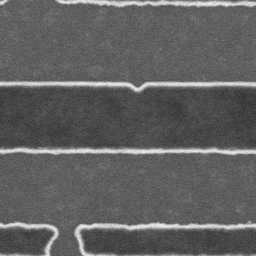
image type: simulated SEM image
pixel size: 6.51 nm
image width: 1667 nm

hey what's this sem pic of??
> one or a few lines or trenches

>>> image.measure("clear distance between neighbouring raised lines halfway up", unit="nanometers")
496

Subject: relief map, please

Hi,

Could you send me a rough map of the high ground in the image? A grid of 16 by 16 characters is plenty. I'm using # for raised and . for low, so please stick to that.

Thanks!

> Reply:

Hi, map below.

................
................
................
................
................
################
################
################
################
..............#.
................
................
................
................
###..###########
###..###########